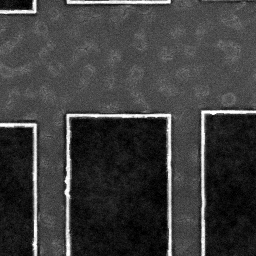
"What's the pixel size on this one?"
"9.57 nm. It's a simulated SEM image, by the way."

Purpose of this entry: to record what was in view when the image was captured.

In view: one or a few lines or trenches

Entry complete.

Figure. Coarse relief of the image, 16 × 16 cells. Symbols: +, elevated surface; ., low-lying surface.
++..............
................
................
................
................
................
................
....++++++...+++
++..+++++++..+++
++..+++++++..+++
++..+++++++..+++
++..+++++++..+++
++..+++++++..+++
++..+++++++..+++
++..+++++++..+++
++..+++++++..+++